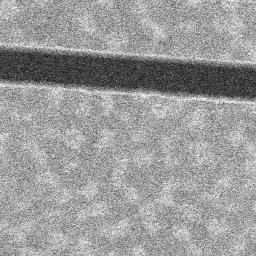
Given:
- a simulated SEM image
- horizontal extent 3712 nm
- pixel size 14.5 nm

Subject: one or a few lines or trenches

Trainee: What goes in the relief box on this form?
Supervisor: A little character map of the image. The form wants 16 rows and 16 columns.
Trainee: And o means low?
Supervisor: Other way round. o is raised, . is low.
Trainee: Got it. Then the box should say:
oooooooooooooooo
oooooooooooooooo
oooooooooooooooo
........oooooooo
................
ooooo...........
oooooooooooooooo
oooooooooooooooo
oooooooooooooooo
oooooooooooooooo
oooooooooooooooo
oooooooooooooooo
oooooooooooooooo
oooooooooooooooo
oooooooooooooooo
oooooooooooooooo